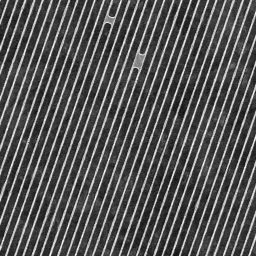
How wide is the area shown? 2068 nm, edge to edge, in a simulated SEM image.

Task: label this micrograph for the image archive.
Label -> parallel lines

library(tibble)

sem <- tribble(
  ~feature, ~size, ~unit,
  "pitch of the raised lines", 0.0663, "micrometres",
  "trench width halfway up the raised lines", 0.0544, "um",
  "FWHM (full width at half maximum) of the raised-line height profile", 11.5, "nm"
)